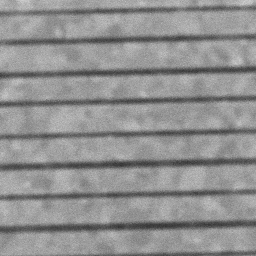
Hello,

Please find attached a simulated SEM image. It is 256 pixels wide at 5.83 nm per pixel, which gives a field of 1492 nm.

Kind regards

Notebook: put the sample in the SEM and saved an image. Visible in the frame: parallel lines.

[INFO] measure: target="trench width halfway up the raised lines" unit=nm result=38.6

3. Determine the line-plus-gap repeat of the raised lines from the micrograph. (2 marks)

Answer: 0.181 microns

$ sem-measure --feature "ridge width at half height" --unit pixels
23.1